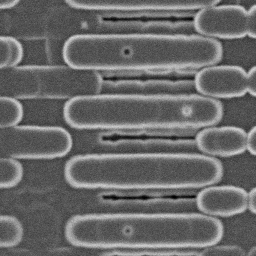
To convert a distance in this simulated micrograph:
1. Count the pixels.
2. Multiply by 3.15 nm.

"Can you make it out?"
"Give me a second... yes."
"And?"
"wiring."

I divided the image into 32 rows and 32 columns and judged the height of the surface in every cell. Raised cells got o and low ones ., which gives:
oo.......oooooooooooooooooo.....
.........................ooooooo
........................oooooooo
.........................ooooooo
.........oooooooooooo...oooooooo
oo......ooooooooooooooooooo.....
ooo.....oooooooooooooooooooo....
oo......ooooooooooooooooooo.....
ooo......ooooooooo.......ooooo..
oooo.....................ooooooo
oooo.....................ooooooo
oooo.....................ooooooo
oo.......oooooooooooooooooo.....
ooo.....oooooooooooooooooooo....
ooo.....oooooooooooooooooooo....
oo.......oooooooooooooooooo.....
oooooooo.................ooooo.o
ooooooooo................ooooooo
ooooooooo................ooooooo
ooooooo....oooooooooooooooo.....
oo.......oooooooooooooooooo.....
ooo.....oooooooooooooooooooo....
oo.......oooooooooooooooooo.....
.........................ooooo..
.........................ooooooo
.........................ooooooo
.........................ooooo..
oo.......oooooooooooooooooo.....
oo.......ooooooooooooooooooo....
oo.......ooooooooooooooooooo....
oo.......oooooooooooooooooo.....
................................